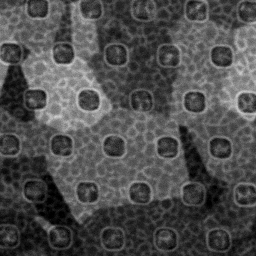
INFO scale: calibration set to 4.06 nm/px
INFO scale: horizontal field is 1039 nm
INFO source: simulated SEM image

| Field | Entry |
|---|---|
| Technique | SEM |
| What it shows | a regular array of holes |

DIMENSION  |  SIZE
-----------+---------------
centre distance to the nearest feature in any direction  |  214 nanometers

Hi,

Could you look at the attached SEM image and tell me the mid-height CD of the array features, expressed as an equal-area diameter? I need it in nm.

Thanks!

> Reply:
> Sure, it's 96.8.